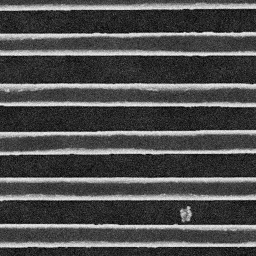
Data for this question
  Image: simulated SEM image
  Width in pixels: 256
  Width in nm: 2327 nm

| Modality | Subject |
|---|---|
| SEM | lines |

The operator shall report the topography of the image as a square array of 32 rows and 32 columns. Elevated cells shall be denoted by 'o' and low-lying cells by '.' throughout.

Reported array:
oooooooooooooooooooooooooooooooo
................................
................................
................................
oooooooooooooooooooooooooooooooo
oooooooooooooooooooooooooooooooo
oooooooooooooooooooooooooooooooo
................................
................................
................................
................................
oooooooooooooooooooooooooooooooo
oooooooooooooooooooooooooooooooo
................................
................................
................................
.........................ooooooo
oooooooooooooooooooooooooooooooo
oooooooooooooooooooooooooooooooo
................................
................................
................................
oooooooooooooooooooooooooooooooo
oooooooooooooooooooooooooooooooo
oooooooooooooooooooooooooooooooo
................................
................................
................................
oooooooooooooooooooooooooooooooo
oooooooooooooooooooooooooooooooo
oooooooooooooooooooooooooooooooo
................................